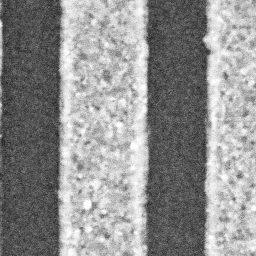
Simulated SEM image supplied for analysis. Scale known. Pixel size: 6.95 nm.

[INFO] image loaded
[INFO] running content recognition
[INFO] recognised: one or a few lines or trenches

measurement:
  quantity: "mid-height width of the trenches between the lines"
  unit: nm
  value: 507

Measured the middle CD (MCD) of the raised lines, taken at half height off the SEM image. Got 510 nanometres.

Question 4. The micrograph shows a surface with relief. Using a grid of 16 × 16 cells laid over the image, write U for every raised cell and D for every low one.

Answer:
DDDDUUUUUDDDDUUU
DDDDUUUUUDDDDUUU
DDDDUUUUUDDDDUUU
DDDDUUUUUDDDDDUU
DDDDUUUUUDDDDUUU
DDDDUUUUUDDDDUUU
DDDDUUUUUDDDDUUU
DDDDUUUUUDDDDUUU
DDDDUUUUUDDDDUUU
DDDDUUUUUDDDDUUU
DDDDUUUUUDDDDUUU
DDDDUUUUUDDDDUUU
DDDDUUUUUDDDDUUU
DDDDUUUUUDDDDUUU
DDDDUUUUUDDDDUUU
DDDDUUUUUDDDDUUU